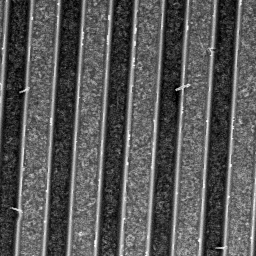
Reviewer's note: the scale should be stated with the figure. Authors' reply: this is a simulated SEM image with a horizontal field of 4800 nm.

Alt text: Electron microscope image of parallel lines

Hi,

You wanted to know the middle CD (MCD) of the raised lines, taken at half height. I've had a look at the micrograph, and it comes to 510 nm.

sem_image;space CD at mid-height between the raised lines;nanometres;458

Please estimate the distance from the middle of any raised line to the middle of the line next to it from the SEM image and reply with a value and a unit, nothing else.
972 nm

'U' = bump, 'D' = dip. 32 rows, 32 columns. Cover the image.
UDDDUUUDDDDUUUDDDUUUDDDDUUUDDDUU
UDDDUUUDDDUUUUDDDUUUDDDUUUUDDDUU
UDDDUUUDDDUUUUDDDUUUDDDUUUUDDDUU
UDDDUUUDDDUUUUDDDUUUDDDUUUUDDDUU
UDDDUUUDDDUUUUDDDUUUDDDUUUUDDDUU
UDDDUUUDDDUUUUDDDUUUDDDUUUUDDDUU
UDDDUUUDDDUUUDDDDUUUDDDUUUDDDDUU
DDDDUUUDDDUUUDDDDUUUDDDUUUDDDDUU
DDDDUUUDDDUUUDDDUUUUDDDUUUDDDUUU
DDDUUUUDDDUUUDDDUUUUDDDUUUDDDUUU
DDDUUUUDDDUUUDDDUUUUDDDUUUDDDUUU
DDDUUUUDDDUUUDDDUUUUDDDUUUDDDUUU
DDDUUUUDDDUUUDDDUUUUDDDUUUDDDUUU
DDDUUUUDDDUUUDDDUUUUDDDUUUDDDUUU
DDDUUUUDDDUUUDDDUUUUDDDUUUDDDUUU
DDDUUUDDDDUUUDDDUUUDDDDUUUDDDUUU
DDDUUUDDDDUUUDDDUUUDDDDUUUDDDUUU
DDDUUUDDDUUUUDDDUUUDDDUUUUDDDUUU
DDDUUUDDDUUUUDDDUUUDDDUUUUDDDUUU
DDDUUUDDDUUUUDDDUUUDDDUUUUDDDUUU
DDDUUUDDDUUUUDDDUUUDDDUUUUDDDUUU
DDDUUUDDDUUUUDDDUUUDDDUUUUDDDUUU
DDDUUUDDDUUUDDDDUUUDDDUUUDDDDUUU
DDDUUUDDDUUUDDDDUUUDDDUUUUDDDUUU
DDDUUUDDDUUUDDDUUUUDDDUUUDDDDUUU
DDDUUUDDDUUUDDDUUUUDDDUUUDDDUUUU
DDUUUUDDDUUUDDDUUUUDDDUUUDDDUUUU
DDUUUUDDDUUUDDDUUUUDDDUUUDDDUUUU
DDUUUUDDDUUUDDDUUUUDDDUUUDDDUUUU
DDUUUUDDDUUUDDDUUUUDDDUUUDDDUUUU
DDUUUUDDDUUUDDDUUUUDDDUUUDDDUUUD
DDUUUDDDDUUUDDDUUUDDDDUUUDDDUUUD